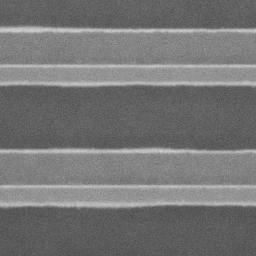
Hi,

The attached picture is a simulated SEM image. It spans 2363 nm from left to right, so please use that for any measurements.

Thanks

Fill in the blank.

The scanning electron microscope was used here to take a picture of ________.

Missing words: lines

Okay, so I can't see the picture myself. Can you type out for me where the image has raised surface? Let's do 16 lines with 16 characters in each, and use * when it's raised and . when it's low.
................
................
****************
****************
****************
................
................
................
................
**..**.******..*
****************
****************
****************
................
................
................